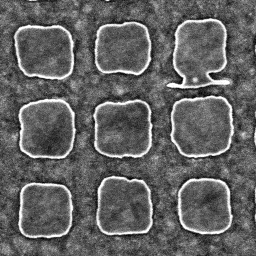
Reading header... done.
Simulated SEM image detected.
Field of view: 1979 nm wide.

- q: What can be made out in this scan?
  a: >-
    a regular array of raised bodies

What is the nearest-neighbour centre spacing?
0.593 microns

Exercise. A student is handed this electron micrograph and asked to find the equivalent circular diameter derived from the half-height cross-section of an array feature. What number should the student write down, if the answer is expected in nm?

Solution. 460